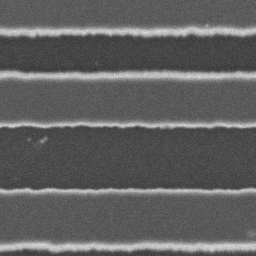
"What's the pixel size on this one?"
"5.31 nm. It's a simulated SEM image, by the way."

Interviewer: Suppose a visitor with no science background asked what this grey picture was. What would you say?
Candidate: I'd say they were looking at lines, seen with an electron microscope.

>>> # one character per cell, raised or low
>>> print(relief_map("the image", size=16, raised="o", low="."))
oooooooooooooooo
oooooooooooooooo
................
................
................
oooooooooooooooo
oooooooooooooooo
oooooooooooooooo
................
................
................
................
oooooooooooooooo
oooooooooooooooo
oooooooooooooooo
...o............